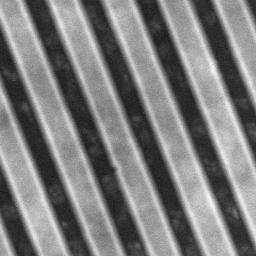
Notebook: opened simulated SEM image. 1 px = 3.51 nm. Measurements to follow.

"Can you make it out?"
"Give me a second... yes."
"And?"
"parallel lines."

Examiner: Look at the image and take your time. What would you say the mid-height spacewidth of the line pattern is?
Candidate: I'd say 79.8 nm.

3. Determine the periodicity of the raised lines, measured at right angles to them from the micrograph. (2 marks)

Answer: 180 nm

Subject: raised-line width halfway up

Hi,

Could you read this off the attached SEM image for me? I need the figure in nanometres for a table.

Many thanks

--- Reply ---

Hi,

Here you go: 101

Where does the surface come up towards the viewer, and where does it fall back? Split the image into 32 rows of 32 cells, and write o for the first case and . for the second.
ooo...oooo...oooo...oooo...oooo.
ooo....ooo....ooo...oooo...oooo.
oooo...oooo...oooo...oooo...ooo.
oooo...oooo...oooo...oooo...oooo
.oooo...oooo...ooo....ooo....ooo
.oooo...oooo...oooo...oooo...ooo
..ooo...oooo....ooo...oooo...ooo
..oooo...oooo...oooo...oooo...oo
..oooo...oooo...oooo...oooo...oo
...oooo...oooo...ooo....ooo...oo
...oooo...oooo...oooo...oooo...o
....ooo....ooo....ooo...oooo...o
o...oooo...oooo...oooo...oooo...
o...oooo...oooo...oooo...oooo...
oo...oooo...oooo...ooo....ooo...
oo...oooo...oooo...oooo...oooo..
oo....ooo....ooo...oooo...oooo..
ooo...oooo...oooo...oooo...oooo.
ooo...oooo...oooo...oooo...oooo.
oooo...oooo...oooo...ooo....ooo.
oooo...oooo...oooo...oooo...oooo
.ooo....ooo....ooo...oooo...oooo
.oooo...oooo...oooo...oooo...ooo
.oooo...oooo...oooo...oooo...ooo
..oooo...oooo...oooo...ooo....oo
..oooo...oooo...oooo...oooo...oo
...ooo....ooo....ooo...oooo...oo
...oooo...oooo...oooo...oooo...o
...oooo...oooo...oooo...oooo...o
o...oooo...oooo...oooo...oooo...
o...oooo...oooo...oooo...oooo...
oo...ooo....ooo....ooo...oooo...